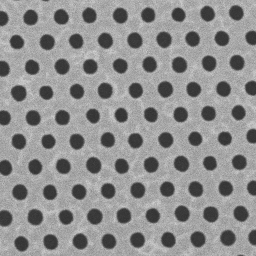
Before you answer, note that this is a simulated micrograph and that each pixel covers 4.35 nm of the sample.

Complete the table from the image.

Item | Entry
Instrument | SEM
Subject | a regular array of holes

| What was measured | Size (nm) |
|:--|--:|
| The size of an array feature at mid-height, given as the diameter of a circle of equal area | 64.9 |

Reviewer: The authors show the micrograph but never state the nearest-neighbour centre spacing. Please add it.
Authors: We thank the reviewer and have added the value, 123 nanometres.